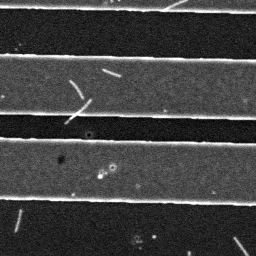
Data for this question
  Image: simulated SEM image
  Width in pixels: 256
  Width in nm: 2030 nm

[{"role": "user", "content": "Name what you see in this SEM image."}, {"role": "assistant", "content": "lines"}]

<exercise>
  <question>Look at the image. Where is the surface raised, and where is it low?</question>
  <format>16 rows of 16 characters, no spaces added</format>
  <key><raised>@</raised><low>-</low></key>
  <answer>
--@@@@@@@@@@@@@@
----------------
----------------
@@@@@-----------
@@@@@@@@@@@@@@@@
@@@@@@@@@@@@@@@@
@@@@@@@@@@@@@@@@
----------------
----------------
@@@@@@@@@@@@@@@@
@@@@@@@@@@@@@@@@
@@@@@@@@@@@@@@@@
---@@@@@@@@@@@@@
----------------
----------------
----------------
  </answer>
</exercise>